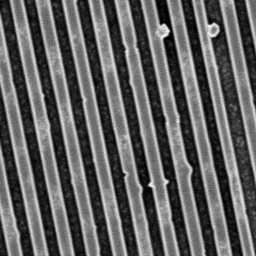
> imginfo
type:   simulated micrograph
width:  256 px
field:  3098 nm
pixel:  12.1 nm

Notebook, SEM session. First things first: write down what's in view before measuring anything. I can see parallel lines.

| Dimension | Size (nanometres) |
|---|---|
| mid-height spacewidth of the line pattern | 148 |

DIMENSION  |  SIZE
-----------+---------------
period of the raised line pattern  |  309 nm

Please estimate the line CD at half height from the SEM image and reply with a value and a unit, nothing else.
159 nm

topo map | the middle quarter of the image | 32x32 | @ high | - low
---@@@---@@@@---@@@----@@@---@@@
---@@@----@@@---@@@@---@@@---@@@
---@@@@---@@@----@@@---@@@---@@@
----@@@---@@@----@@@---@@@----@@
@---@@@---@@@@--@@@@---@@@@---@@
@---@@@---@@@@---@@@----@@@---@@
@---@@@----@@@---@@@@---@@@---@@
@---@@@@---@@@----@@@---@@@---@@
@----@@@---@@@----@@@---@@@----@
@----@@@---@@@@---@@@---@@@@---@
@@---@@@---@@@@---@@@----@@@---@
@@---@@@----@@@---@@@@---@@@---@
@@---@@@@---@@@----@@@---@@@----
@@----@@@---@@@----@@@---@@@@---
@@----@@@---@@@@---@@@----@@@---
@@@---@@@---@@@@---@@@----@@@---
@@@---@@@----@@@---@@@@---@@@---
@@@---@@@@---@@@---@@@@---@@@---
@@@----@@@---@@@----@@@---@@@---
@@@----@@@---@@@@---@@@---@@@@--
@@@@---@@@---@@@@---@@@----@@@--
-@@@---@@@----@@@---@@@@---@@@--
-@@@---@@@@---@@@----@@@---@@@--
-@@@---@@@@---@@@----@@@---@@@--
-@@@----@@@---@@@@---@@@---@@@@-
-@@@@---@@@---@@@@---@@@----@@@-
--@@@---@@@----@@@---@@@@---@@@@
--@@@---@@@@---@@@---@@@@---@@@@
--@@@----@@@---@@@----@@@---@@@@
--@@@----@@@---@@@@---@@@@--@@@@
--@@@@---@@@----@@@---@@@----@@@
---@@@---@@@----@@@---@@@@---@@@